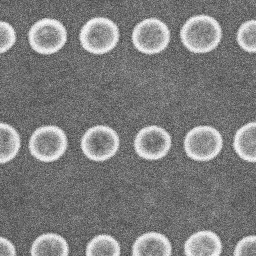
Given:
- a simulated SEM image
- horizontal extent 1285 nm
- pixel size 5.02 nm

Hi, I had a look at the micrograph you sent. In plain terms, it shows a regular array of raised bodies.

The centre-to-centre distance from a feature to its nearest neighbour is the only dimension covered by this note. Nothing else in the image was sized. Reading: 256 nm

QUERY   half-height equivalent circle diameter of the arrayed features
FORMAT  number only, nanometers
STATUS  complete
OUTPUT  170